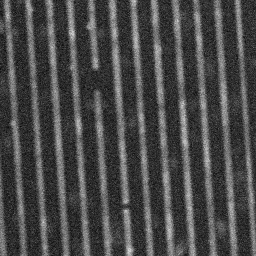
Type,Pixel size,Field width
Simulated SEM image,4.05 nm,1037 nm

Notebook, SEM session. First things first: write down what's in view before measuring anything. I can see parallel lines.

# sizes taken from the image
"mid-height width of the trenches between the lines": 0.0667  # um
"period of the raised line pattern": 84.9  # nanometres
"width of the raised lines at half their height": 19.7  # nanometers